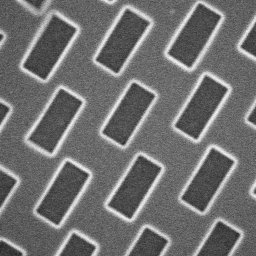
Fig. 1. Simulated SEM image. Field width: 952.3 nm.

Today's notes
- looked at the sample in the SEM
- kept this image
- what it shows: an array of small figures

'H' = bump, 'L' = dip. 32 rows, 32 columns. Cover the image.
HHHLLLHHHHHHHHHHHHHHHHHHHHHHHHHH
HHHHHHHHHHHHHHHLLHHHHHHHLLLHHHHH
HHHHHHLLHHHHHHHLLLHHHHHLLLLLHHHH
HHHHHLLLLHHHHHLLLLHHHHHLLLLHHHHL
HHHHHLLLLHHHHLLLLLHHHHLLLLHHHHHL
HHHHLLLLLHHHHLLLLHHHHLLLLLHHHHLL
HHHHLLLLHHHHLLLLLHHHHLLLLHHHHHHL
HHHLLLLHHHHHLLLLHHHHHHLLLHHHHHHH
HHHLLLLHHHHHHLLHHHHHHHHHHHHHHHHH
HHHHHLHHHHHHHHHHHHHHHHHHHHHHHHHH
HHHHHHHHHHHHHHHHLHHHHHHHHLLLHHHH
HHHHHHHLLHHHHHHHLLLHHHHHLLLLHHHH
HHHHHHHLLLHHHHHLLLLHHHHHLLLLHHHH
LHHHHHLLLLHHHHLLLLLHHHHLLLLHHHHH
LHHHHLLLLHHHHHLLLLHHHHLLLLLHHHHL
HHHHHLLLLHHHHLLLLHHHHHLLLLHHHHHL
HHHHLLLLHHHHHLLLLHHHHHHLLHHHHHHH
HHHHLLLLHHHHHHLLHHHHHHHHHHHHHHHH
HHHHHLLHHHHHHHHHHHHHHHHHHHHHHHHH
HHHHHHHHHHHHHHHHHLHHHHHHHHLLHHHH
HHHHHHHHLHHHHHHHHLLLHHHHHLLLLHHH
LHHHHHHLLLLHHHHHLLLLHHHHHLLLLHHH
LLHHHHHLLLLHHHHLLLLHHHHHLLLLHHHH
LLHHHHLLLLHHHHHLLLLHHHHLLLLHHHHH
LHHHHHLLLLHHHHLLLLHHHHHLLLLHHHHH
HHHHHLLLLHHHHHLLLLHHHHHLLLHHHHHH
HHHHHLLLHHHHHHLLLHHHHHHHHHHHHHHH
HHHHHHLLHHHHHHHHHHHHHHHHHHHHHHHH
HHHHHHHHHHHHHHHHHHLHHHHHHHHLLHHH
HHHHHHHHHLHHHHHHHLLLHHHHHHLLLLHH
LHHHHHHHLLLLHHHHHLLLLHHHHLLLLHHH
LLLHHHHLLLLLHHHHLLLLHHHHHLLLLHHH